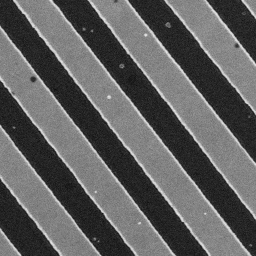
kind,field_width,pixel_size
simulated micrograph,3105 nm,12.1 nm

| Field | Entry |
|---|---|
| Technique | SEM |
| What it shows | lines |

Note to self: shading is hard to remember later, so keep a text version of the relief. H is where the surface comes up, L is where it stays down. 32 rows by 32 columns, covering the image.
LLHHHHHLLLLHHHHHLLLLLHHHHHLLLLLH
LLLHHHHHLLLLHHHHHLLLLLHHHHHLLLLH
LLLLHHHHLLLLLHHHHHLLLLLHHHHHLLLL
LLLLHHHHHLLLLLHHHHHLLLLHHHHHLLLL
HLLLLHHHHHLLLLHHHHHLLLLLHHHHHLLL
HHLLLLHHHHHLLLLHHHHHLLLLLHHHHHLL
HHLLLLLHHHHHLLLLHHHHHLLLLLHHHHHL
HHHLLLLHHHHHLLLLLHHHHHLLLLHHHHHH
HHHHLLLLHHHHHLLLLLHHHHHLLLLHHHHH
HHHHHLLLLHHHHHLLLLHHHHHLLLLLHHHH
HHHHHHLLLLHHHHHLLLLHHHHHLLLLLHHH
LHHHHHLLLLHHHHHLLLLLHHHHHLLLLLHH
LLHHHHHLLLLHHHHHLLLLLHHHHHLLLLLH
LLLHHHHHLLLLHHHHHLLLLHHHHHLLLLLH
LLLLHHHHHLLLLHHHHHLLLLHHHHHLLLLL
LLLLHHHHHLLLLHHHHHHLLLLHHHHHLLLL
HLLLLHHHHHLLLLHHHHHLLLLLHHHHHLLL
HLLLLLHHHHHLLLLHHHHHLLLLHHHHHHLL
HHLLLLLHHHHHLLLLHHHHHLLLLHHHHHLL
HHHLLLLHHHHHLLLLLHHHHHLLLLHHHHHL
HHHHLLLLHHHHHLLLLHHHHHLLLLLHHHHH
HHHHLLLLLHHHHHLLLLHHHHHLLLLHHHHH
HHHHHLLLLLHHHHHLLLLHHHHHLLLLHHHH
LHHHHHLLLLHHHHHLLLLLHHHHHLLLLHHH
LLHHHHHLLLLHHHHHLLLLHHHHHLLLLLHH
LLHHHHHHLLLLHHHHHLLLLHHHHHLLLLHH
LLLHHHHHLLLLLHHHHHLLLLHHHHHLLLLH
LLLLHHHHHLLLLLHHHHHLLLLHHHHHLLLL
LLLLLHHHHHLLLLHHHHHLLLLHHHHHHLLL
HLLLLLHHHHHLLLLHHHHHLLLLHHHHHLLL
HLLLLLHHHHHLLLLLHHHHHLLLLHHHHHLL
HHLLLLLHHHHHLLLLLHHHHHLLLLHHHHHL